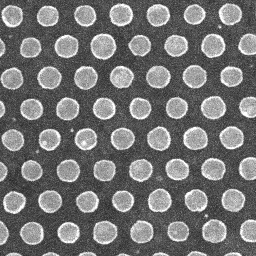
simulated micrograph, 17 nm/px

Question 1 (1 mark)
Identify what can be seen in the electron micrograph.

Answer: a regular array of raised bodies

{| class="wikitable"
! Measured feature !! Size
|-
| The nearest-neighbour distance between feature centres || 605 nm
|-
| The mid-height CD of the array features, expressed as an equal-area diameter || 371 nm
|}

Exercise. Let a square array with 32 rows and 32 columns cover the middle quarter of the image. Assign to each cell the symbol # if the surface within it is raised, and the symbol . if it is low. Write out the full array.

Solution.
................................
...#####....####.....#####.....#
...#####....#####....#####....##
...#####....#####....#####....##
...#####....#####....#####....##
....###......###......###......#
................................
................................
...........................##...
###.....####.....####.....####..
####....#####....#####....#####.
####....#####...######....#####.
###.....####.....####.....####..
##.......##.......##........#...
................................
................................
....###......###......####.....#
...#####....#####....#####....##
...#####....#####....#####....##
...#####....#####....#####....##
....####.....####.....####.....#
........................#.......
................................
................................
###......###.....####.....####..
####....#####....#####....#####.
####....#####...######....#####.
####....#####....#####....#####.
###.....####.....####......###..
................................
................................
.......................##.......